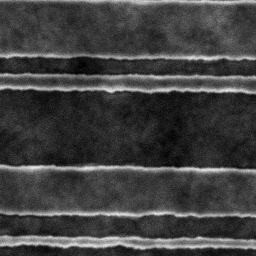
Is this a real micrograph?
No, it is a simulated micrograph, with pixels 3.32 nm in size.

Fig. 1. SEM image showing lines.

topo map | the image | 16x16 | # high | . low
################
################
################
################
################
################
................
................
................
................
#########.#.....
################
################
################
################
................